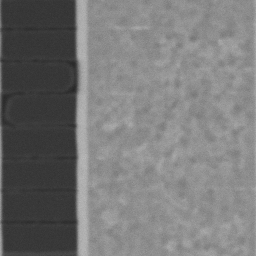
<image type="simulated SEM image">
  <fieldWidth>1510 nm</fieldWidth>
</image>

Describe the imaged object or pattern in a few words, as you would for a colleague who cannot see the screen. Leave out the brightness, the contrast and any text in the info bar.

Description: wiring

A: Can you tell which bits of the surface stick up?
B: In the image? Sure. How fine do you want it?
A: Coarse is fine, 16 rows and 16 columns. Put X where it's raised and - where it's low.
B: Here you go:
-----XXXXXXXXXXX
-----XXXXXXXXXXX
-----XXXXXXXXXXX
-----XXXXXXXXXXX
-----XXXXXXXXXXX
-----XXXXXXXXXXX
-----XXXXXXXXXXX
-----XXXXXXXXXXX
-----XXXXXXXXXXX
-----XXXXXXXXXXX
-----XXXXXXXXXXX
-----XXXXXXXXXXX
-----XXXXXXXXXXX
-----XXXXXXXXXXX
-----XXXXXXXXXXX
-----XXXXXXXXXXX